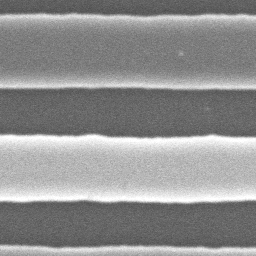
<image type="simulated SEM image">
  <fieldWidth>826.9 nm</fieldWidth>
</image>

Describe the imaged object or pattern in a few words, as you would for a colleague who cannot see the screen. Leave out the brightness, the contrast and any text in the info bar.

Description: lines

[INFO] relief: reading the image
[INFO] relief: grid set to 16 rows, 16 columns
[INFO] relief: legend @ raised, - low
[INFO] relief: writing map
----------------
@@@@@@@@@@@@@@@@
@@@@@@@@@@@@@@@@
@@@@@@@@@@@@@@@@
@@@@@@@@@@@@@@@@
----------@@@-@@
----------------
----------------
@-@--@----------
@@@@@@@@@@@@@@@@
@@@@@@@@@@@@@@@@
@@@@@@@@@@@@@@@@
@@@@@@@@@@@@@@@@
----------------
----------------
@@@---@@@@@-----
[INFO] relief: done